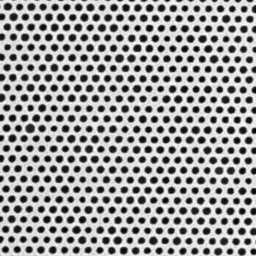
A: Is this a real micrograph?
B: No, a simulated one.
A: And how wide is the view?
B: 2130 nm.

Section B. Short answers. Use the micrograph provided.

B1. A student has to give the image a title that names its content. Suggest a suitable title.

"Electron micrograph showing a regular array of holes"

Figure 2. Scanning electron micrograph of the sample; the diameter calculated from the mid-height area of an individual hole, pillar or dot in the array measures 0.0651 µm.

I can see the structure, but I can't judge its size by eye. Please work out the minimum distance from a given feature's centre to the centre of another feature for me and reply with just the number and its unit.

0.0952 micrometres